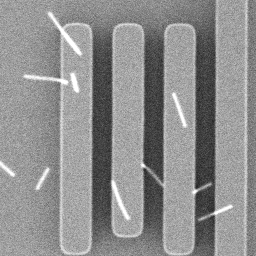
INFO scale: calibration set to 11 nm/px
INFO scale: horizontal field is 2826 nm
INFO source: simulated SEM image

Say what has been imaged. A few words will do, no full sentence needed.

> groups of lines, slits or small figures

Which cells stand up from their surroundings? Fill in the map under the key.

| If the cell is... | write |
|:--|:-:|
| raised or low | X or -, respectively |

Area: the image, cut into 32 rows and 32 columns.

---------------------------XXXX-
---------------------------XXXX-
---------------------------XXXX-
--------XXX---XXXX---XXX---XXXX-
--------XXX---XXXX---XXX---XXXX-
--------XXX---XXXX---XXX---XXXX-
--------XXX---XXXX---XXX---XXXX-
--------XXX---XXXX---XXX---XXXX-
--------XXX---XXXX---XXX---XXXX-
--------XXX---XXXX---XXX---XXXX-
--------XXX---XXXX---XXX---XXXX-
--------XXX---XXXX---XXX---XXXX-
--------XXX---XXXX---XXX---XXXX-
--------XXX---XXXX---XXX---XXXX-
--------XXX---XXXX---XXX---XXXX-
--------XXX---XXXX---XXX---XXXX-
--------XXX---XXXX---XXX---XXXX-
--------XXX---XXXX---XXX---XXXX-
--------XXX---XXXX---XXX---XXXX-
--------XXX---XXXX---XXX---XXXX-
--------XXX---XXXX---XXX---XXXX-
--------XXX---XXXX---XXX---XXXX-
--------XXX---XXXX---XXX---XXXX-
--------XXX---XXXX---XXX---XXXX-
--------XXX---XXXX---XXX---XXXX-
--------XXX---XXXX---XXX---XXXX-
--------XXX---XXXX---XXX---XXXX-
--------XXX---XXXX---XXX---XXXX-
--------XXX---XXXX---XXX---XXXX-
--------XXX----XX----XXX---XXXX-
--------XXX----------XXX---XXXX-
--------XXX----------XXX---XXXX-